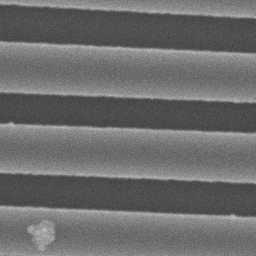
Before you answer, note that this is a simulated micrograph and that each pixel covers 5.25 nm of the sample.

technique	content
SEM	lines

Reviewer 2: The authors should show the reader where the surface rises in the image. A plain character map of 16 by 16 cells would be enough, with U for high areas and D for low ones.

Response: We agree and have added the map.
DDDDDUUUUUUUUUUU
DDDDDDDDDDDDDDDD
DDDDDDDDDDDDDDDD
UUUUUUUUUUUUUUUU
UUUUUUUUUUUUUUUU
UUUUUUUUUUUUUUUU
DDDDDDDDDDDDDDDD
DDDDDDDDDDDDDDDD
UUUUUUUUUUUUUUUU
UUUUUUUUUUUUUUUU
UUUUUUUUUUUUUUUU
DDDDDDDDDDDDDDDD
DDDDDDDDDDDDDDDD
UUUUUUUUUUUUUUUD
UUUUUUUUUUUUUUUU
UUUUUUUUUUUUUUUU